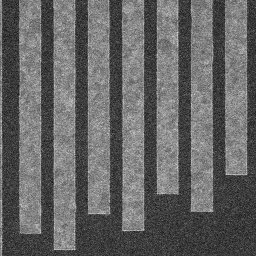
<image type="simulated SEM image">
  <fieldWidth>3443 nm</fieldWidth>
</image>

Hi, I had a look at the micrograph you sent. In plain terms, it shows parallel lines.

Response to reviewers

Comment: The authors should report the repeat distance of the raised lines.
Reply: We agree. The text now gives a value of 0.462 micrometres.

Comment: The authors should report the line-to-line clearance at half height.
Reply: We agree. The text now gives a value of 180 nm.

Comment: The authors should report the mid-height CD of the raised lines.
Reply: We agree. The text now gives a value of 0.279 micrometres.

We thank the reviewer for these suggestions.